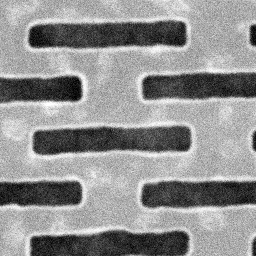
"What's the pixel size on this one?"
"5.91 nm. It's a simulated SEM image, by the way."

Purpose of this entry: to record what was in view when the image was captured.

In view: holes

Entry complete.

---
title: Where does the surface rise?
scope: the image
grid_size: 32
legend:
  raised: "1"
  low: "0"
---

11111111111111111111111111111111
11111111111111111111111111111111
11111111111111111111101111111111
11110000000000000000000111111110
11110000000000000000000111111110
11110000000000000000000111111110
11111111111111111111111111111111
11111111111111111111111111111111
11111111111111111111111111111111
11111111001111111100000000000000
00000000001111111100000000000000
00000000001111111100000000000000
00000000001111111100111101111111
11111111111111111111111111111111
11111111111111111111111111111111
11111111111111111111111111111111
11110000000000000000000011111111
11110000000000000000000011111110
11110000000000000000000011111111
11111111111111111111111111111111
11111111111111111111111111111111
11111111111111111111111111111111
11111000011111111111111111111111
00000000001111111100000000000000
00000000001111111100000000000000
00000000001111111100000000000000
11111111111111111111111111111111
11111111111111111111111111111111
11111111111111111111111111111111
11110000000000000000000011111111
11110000000000000000000011111110
11110000000000000000000011111110